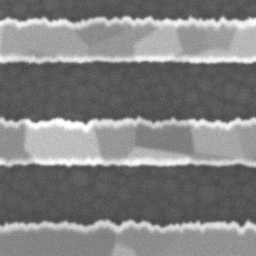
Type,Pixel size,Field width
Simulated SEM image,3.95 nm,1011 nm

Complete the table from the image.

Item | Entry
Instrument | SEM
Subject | lines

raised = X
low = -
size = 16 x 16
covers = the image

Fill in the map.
----------------
XXXXXXXXXXXXXXXX
XXXXXXXXXXXXXXXX
XXXXXXXXXXXXXXXX
----------------
----------------
----------------
---X--X-X------X
XXXXXXXXXXXXXXXX
XXXXXXXXXXXXXXXX
----------------
----------------
----------------
----------------
XXXXXXXXXXXXXXXX
XXXXXXXXXXXXXXXX